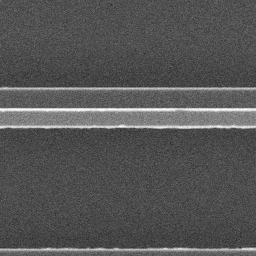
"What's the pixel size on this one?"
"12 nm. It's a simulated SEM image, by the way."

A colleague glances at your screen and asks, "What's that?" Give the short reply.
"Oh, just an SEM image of lines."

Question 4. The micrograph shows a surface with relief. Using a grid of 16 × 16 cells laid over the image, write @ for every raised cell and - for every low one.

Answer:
----------------
----------------
----------------
----------------
----------------
----------------
@@@@@@@@@@@@@@@@
@@@@@@@@@@@@@@@@
----------------
----------------
----------------
----------------
----------------
----------------
----------------
----------------